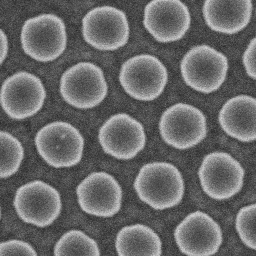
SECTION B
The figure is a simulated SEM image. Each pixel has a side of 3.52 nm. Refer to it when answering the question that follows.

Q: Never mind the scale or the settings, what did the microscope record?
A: a regular array of raised bodies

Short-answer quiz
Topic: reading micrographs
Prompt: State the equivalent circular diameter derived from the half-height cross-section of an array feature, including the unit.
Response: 155 nanometres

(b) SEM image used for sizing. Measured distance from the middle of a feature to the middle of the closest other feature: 61.3 pixels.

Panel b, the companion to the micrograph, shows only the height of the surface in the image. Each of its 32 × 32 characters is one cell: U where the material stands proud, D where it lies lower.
DDDDDDDDDDDDDDDDDDDUUUUDDDUUUUUD
DDDDDDDDDDDUUUUDDDUUUUUDDDUUUUUD
DDDDUUUDDDUUUUUUDDUUUUUUDDUUUUUD
DDDUUUUUDDUUUUUUDDUUUUUDDDDUUUDD
UDDUUUUUDDDUUUUUDDDUUUUDDDDDDDDD
UDDUUUUUDDDUUUUDDDDDDDDDDDDDDDDU
UDDUUUUUDDDDDDDDDDDDDDDDUUUDDDDU
DDDDDUDDDDDDDDDDUUUUDDDUUUUUDDDU
DDDDDDDDDUUUDDDUUUUUDDDUUUUUDDDU
DDUUDDDDUUUUUDDUUUUUUDDUUUUUDDDD
DUUUUDDDUUUUUDDUUUUUUDDDUUUUDDDD
UUUUUDDDUUUUUDDDUUUUDDDDDDDDDDDD
UUUUUDDDUUUUUDDDDDDDDDDDDDDDDUUU
DUUUUDDDDDDDDDDDDDDDDUUUDDDDUUUU
DDUDDDDDDDDDDDDUDDDDUUUUUDDDUUUU
DDDDDDUUDDDDDUUUUDDDUUUUUUDDUUUU
DDDDDUUUUUDDDUUUUUDDUUUUUUDDUUUU
UUDDDUUUUUDDDUUUUUDDDUUUUDDDDDUD
UUUDDUUUUUDDDUUUUUDDDDDDDDDDDDDD
UUUDDUUUUUDDDDDUUDDDDDDDDDUUUDDD
UUDDDDUUUDDDDDDDDDDUUDDDDUUUUUDD
UUDDDDDDDDDDDDDDDDUUUUDDDUUUUUDD
DDDDDDDDDDDUUUDDDUUUUUUDDUUUUUDD
DDDUUUDDDDUUUUUDDUUUUUUDDUUUUUDD
DDUUUUUDDDUUUUUDDUUUUUUDDDUUUDDD
DDUUUUUDDDUUUUUDDDDUUUDDDDDDDDDD
DDUUUUUDDDDUUUDDDDDDDDDDDDDDDDUU
DDDUUUUDDDDDDDDDDDDDDDDUUUUDDDUU
DDDDDDDDDDDDDDDDUUDDDDUUUUUDDDUU
DDDDDDDDUUUDDDDUUUUUDDUUUUUDDDUU
UUUDDDDUUUUUDDDUUUUUDDUUUUUDDDDU
UUUUDDDUUUUUDDDUUUUUDDDUUUUDDDDD